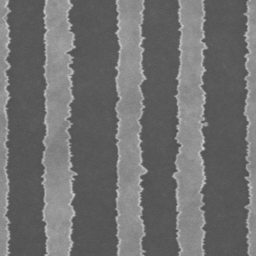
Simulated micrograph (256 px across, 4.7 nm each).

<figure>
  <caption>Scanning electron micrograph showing one or a few lines or trenches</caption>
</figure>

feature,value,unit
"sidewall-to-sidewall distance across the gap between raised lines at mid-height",196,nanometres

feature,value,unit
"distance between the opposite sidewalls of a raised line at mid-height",113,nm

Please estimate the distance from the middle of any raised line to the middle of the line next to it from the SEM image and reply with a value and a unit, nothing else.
0.312 microns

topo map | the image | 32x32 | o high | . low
o.....ooo......ooo....ooo......o
o.....oo.......ooo....ooo......o
o.....oo.......ooo....ooo......o
o.....ooo......ooo.....oo......o
o.....ooo......ooo.....oo......o
o.....ooo......ooo.....ooo.....o
o.....ooo......ooo.....oo......o
o.....ooo......ooo.....oo......o
o.....ooo......ooo.....oo......o
o.....ooo......ooo....ooo......o
o.....ooo......ooo....ooo......o
o.....ooo......ooo....ooo......o
o.....ooo......ooo....oooo.....o
o.....ooo......ooo....ooo......o
o.....ooo......ooo....ooo......o
o.....ooo......oo.....ooo......o
o.....ooo......oo.....ooo......o
o.....ooo......oo.....ooo......o
o.....ooo......ooo.....oo......o
o....oooo......ooo....ooo......o
o....oooo......ooo....ooo......o
o.....ooo......ooo....ooo......o
o....oooo......ooo....oooo.....o
o.....ooo......ooo....ooo......o
o.....ooo......oo.....ooo......o
o.....ooo......ooo....ooo......o
o....oooo......ooo....ooo......o
o.....ooo......ooo....oooo.....o
o.....ooo......ooo....ooo......o
o.....ooo......ooo....ooo......o
o.....ooo......ooo....ooo......o
o.....ooo......ooo.....oo......o